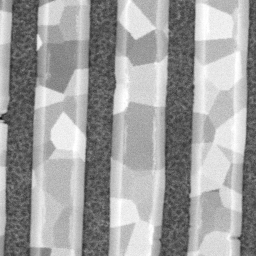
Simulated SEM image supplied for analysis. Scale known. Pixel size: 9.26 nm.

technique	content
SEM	one or a few lines or trenches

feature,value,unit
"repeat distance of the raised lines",731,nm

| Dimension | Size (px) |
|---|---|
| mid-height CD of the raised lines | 40.2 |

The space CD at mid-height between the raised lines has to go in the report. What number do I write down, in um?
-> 0.355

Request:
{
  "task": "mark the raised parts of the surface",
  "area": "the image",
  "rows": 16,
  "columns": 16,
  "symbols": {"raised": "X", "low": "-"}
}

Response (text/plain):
---XX---XX---XX-
---XX---XX---XX-
---XX---XX---XX-
---XX---XX---XX-
---XX---XX---XX-
---XX---XX--XXX-
---XX--XXX---XX-
--XXX--XXX--XXX-
--XXX--XXX--XXX-
--XXX--XXX--XXX-
--XXX--XXX--XXX-
--XXX--XXX--XXX-
--XXX--XXX--XXX-
--XXX--XXX--XXX-
--XXX--XXX--XXX-
--XXX--XXX--XXX-